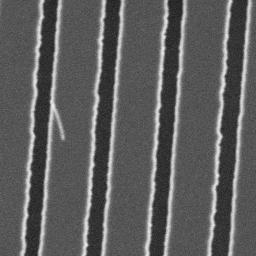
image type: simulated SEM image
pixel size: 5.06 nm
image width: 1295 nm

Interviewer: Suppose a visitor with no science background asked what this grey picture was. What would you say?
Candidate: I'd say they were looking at lines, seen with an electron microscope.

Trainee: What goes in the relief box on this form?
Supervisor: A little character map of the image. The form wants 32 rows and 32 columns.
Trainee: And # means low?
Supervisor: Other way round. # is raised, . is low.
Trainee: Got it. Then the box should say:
#####..######..######..######..#
#####..######..######..######..#
#####..######..######..######..#
#####..######..######..######..#
#####..######..######..#####...#
#####..######..#####...#####...#
#####..######..#####...#####...#
#####..######..#####..######..##
#####..######.######..######..##
#####..#####..######..######..##
####...#####..######..######..##
#####.######..######..######..##
####..######..######..######..##
####..######..######..######..##
####..######..######..######..##
####..######..######..######..##
####..######..######..#####...##
####..######..######..######..##
####..######..######..#####...##
####..######..#####...#####...##
####..######..#####..######..###
####..#####...#####..######..###
####..#####..######..######..###
####..#####..######..######..###
####.######..######..######..###
###..######..######..######..###
###..######..######..######..###
###..######..######..######..###
###..######..######..######..###
###..######..######..######..###
###..######..######..#####...###
###..######..######..#####...###